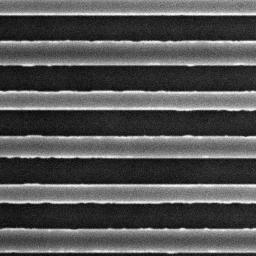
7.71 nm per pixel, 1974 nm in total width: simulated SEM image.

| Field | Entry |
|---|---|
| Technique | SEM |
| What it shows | lines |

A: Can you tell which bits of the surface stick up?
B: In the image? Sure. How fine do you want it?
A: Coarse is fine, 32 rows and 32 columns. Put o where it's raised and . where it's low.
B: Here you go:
oooooooooooooooooooooooooooooooo
oooooooooooooooooooooooooooooooo
................................
................................
................................
oooooooooooooooooooooooooooooooo
oooooooooooooooooooooooooooooooo
oooooooooooooooooooooooooooooooo
................................
................................
................................
.ooo...oo..ooo.ooo..............
oooooooooooooooooooooooooooooooo
oooooooooooooooooooooooooooooooo
................................
................................
................................
oooooooooooooooooooooooooooooooo
oooooooooooooooooooooooooooooooo
oooooooooooooooooooooooooooooooo
................................
................................
................................
oooooooooooooooooooooooooooooooo
oooooooooooooooooooooooooooooooo
................................
................................
................................
................................
oooooooooooooooooooooooooooooooo
oooooooooooooooooooooooooooooooo
.....................o..........